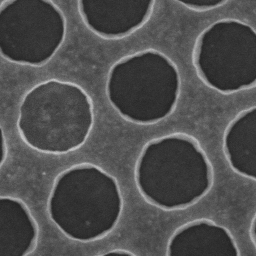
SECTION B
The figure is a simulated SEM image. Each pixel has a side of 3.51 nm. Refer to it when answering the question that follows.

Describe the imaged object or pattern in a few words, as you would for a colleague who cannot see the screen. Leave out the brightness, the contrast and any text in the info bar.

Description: holes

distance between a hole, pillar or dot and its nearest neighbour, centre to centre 318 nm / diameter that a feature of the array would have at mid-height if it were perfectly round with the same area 251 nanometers